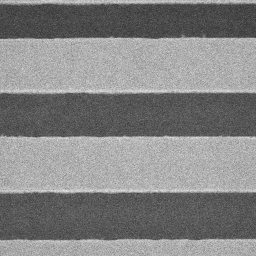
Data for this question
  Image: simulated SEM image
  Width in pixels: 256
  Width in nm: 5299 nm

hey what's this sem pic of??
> lines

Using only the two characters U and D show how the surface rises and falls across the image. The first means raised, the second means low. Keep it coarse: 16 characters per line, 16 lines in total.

DDDDDDDDDDDDDDDD
DDDDDDDDDDDDDDDD
UUUUUUUUUUUUUUUU
UUUUUUUUUUUUUUUU
UUUUUUUUUUUUUUUU
UUUUUUUUUUUUUUUU
DDDDDDDDDDDDDDDD
DDDDDDDDDDDDDDDD
DDDDDDDDDDDDDDDD
UUUUUUUUUUUUUUUU
UUUUUUUUUUUUUUUU
UUUUUUUUUUUUUUUU
DDDDDDDDDDDDDDDD
DDDDDDDDDDDDDDDD
DDDDDDDDDDDDDDDD
UUUUUUUUUUUUUUUU